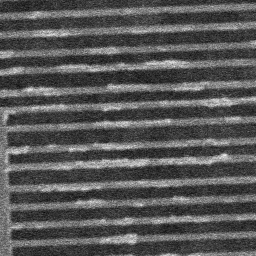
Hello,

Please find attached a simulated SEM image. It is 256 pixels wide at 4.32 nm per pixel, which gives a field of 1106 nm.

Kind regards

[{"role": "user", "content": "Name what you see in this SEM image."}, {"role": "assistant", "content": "parallel lines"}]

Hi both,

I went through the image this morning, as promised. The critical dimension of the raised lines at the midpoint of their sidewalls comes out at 21.6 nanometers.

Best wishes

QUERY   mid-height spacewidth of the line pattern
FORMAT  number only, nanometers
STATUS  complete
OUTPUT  55.5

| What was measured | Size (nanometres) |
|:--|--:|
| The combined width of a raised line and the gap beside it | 82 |